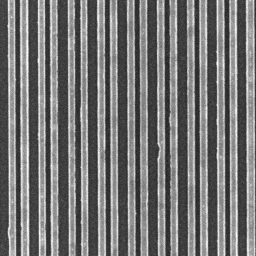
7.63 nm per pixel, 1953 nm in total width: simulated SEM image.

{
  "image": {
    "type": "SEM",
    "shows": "parallel lines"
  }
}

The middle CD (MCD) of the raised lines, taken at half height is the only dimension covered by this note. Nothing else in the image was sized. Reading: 44.8 nm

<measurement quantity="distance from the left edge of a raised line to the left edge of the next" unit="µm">0.114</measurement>